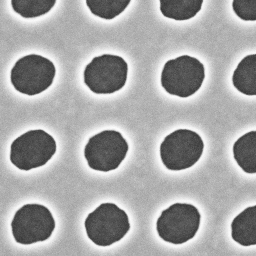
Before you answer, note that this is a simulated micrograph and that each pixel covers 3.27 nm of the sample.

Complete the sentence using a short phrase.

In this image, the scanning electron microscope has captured a regular array of holes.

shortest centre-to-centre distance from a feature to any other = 240 nanometres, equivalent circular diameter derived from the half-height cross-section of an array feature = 142 nanometres